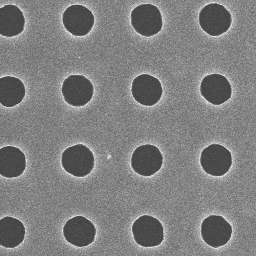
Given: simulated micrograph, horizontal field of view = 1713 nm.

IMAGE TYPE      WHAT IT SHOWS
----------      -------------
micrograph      a regular array of holes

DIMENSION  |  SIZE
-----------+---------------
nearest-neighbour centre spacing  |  0.459 microns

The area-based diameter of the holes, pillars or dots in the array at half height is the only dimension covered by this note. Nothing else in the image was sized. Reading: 210 nm